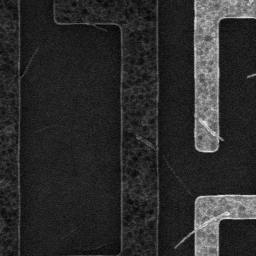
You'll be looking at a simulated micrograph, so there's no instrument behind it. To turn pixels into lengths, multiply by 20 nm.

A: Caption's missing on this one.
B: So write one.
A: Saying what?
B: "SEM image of wiring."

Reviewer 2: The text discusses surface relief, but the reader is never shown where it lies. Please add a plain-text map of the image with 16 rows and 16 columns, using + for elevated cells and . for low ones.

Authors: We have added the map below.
+..+++++++..++++
+....+.+++..++..
+.......++..++..
+.......++..++..
+.......++..++..
+.......++..++..
+.......++..++..
+.......++..++..
+.......++..++..
+.......++......
+.......++......
+.......++......
+.......++..++++
+.......++..++++
+.......++..++..
+.......++..++..